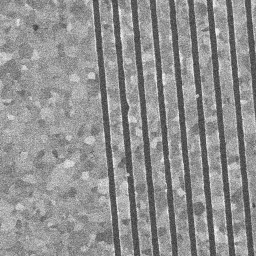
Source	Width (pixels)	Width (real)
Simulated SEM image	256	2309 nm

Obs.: parallel lines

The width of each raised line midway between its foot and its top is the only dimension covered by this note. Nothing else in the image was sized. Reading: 12.2 px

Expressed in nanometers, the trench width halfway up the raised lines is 57.2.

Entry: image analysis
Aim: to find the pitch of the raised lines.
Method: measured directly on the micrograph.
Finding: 170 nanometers